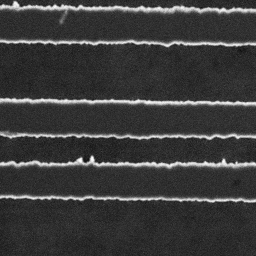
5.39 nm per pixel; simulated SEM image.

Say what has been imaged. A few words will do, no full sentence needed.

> lines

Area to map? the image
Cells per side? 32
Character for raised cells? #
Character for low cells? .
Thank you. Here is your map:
................................
################################
################################
################################
################################
....................##.##.######
................................
................................
................................
................................
................................
................................
#######.........................
################################
################################
################################
################################
................................
................................
................................
#####################.#######.##
################################
################################
################################
################################
................................
................................
................................
................................
................................
................................
................................